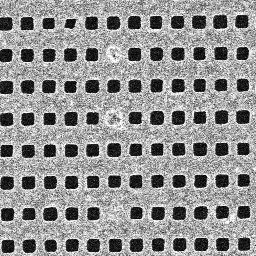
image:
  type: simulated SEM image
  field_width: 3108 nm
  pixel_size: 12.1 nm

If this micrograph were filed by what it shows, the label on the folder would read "a regular array of holes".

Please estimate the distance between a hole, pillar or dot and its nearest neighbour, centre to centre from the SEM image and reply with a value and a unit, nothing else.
260 nm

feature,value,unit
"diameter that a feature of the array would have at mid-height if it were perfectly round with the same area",14.5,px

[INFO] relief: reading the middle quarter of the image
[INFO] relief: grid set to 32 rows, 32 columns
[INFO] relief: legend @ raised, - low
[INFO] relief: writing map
@@@@@@@@@@@@@@@@@@@@@@@@@@@@@@@@
@@@@@@@@@@@@@@@@@@@@@@@@@@@@@@@@
@@@@@@@@@@@@@@@@@@@@@@@@@@@@@@@@
@@@@@@@@@@@@@@@@@@@@@@@@@@@@@@@@
---@@@---@@---@@---@@----@@---@@
---@@----@@---@@----@----@@---@@
---@@----@@---@@----@----@@---@@
@@@@@@@@@@@@@@@@@@@@@@@@@@@@@@@@
@@@@@@@@@@@@@@@@@@@@@@@@@@@@@@@@
@@@@@@@@@@@@@@@@@@@@@@@@@@@@@@@@
@@@@@@@@@@@@@@@@@@@@@@@@@@@@@@@@
@@@@@@@@@@@@@@@@@@@@@@@@@@@@@@@@
----@@---@@@@@@@---@@@---@@---@@
----@----@@@@@@@----@----@@---@@
----@----@@@@@@@---@@@---@@---@@
@--@@@@@@@@@@@@@@@@@@@@@@@@@@@@@
@@@@@@@@@@@@@@@@@@@@@@@@@@@@@@@@
@@@@@@@@@@@@@@@@@@@@@@@@@@@@@@@@
@@@@@@@@@@@@@@@@@@@@@@@@@@@@@@@@
@@@@@@@@@@@@@@@@@@@@@@@@@@@@@@@@
---@@@---@@---@@@---@@---@@---@@
----@----@@---@@----@@---@@---@@
----@----@@---@@---@@@---@@---@@
@-@@@@@@@@@@@@@@@@@@@@@@@@@@@@@@
@@@@@@@@@@@@@@@@@@@@@@@@@@@@@@@@
@@@@@@@@@@@@@@@@@@@@@@@@@@@@@@@@
@@@@@@@@@@@@@@@@@@@@@@@@@@@@@@@@
@@@@@@@@@@@@@@@@@@@@@@@@@@@@@@@@
---@@@---@@---@@----@@---@@---@@
----@@---@@---@@----@@---@@----@
---@@@---@@---@@----@@---@@---@@
@@@@@@@@@@@@@@@@@@@@@@@@@@@@@@@@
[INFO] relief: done